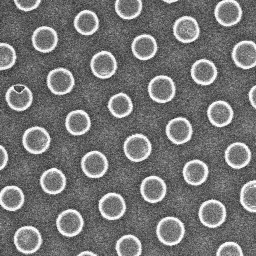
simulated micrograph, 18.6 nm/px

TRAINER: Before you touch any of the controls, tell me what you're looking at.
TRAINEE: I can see a regular array of raised bodies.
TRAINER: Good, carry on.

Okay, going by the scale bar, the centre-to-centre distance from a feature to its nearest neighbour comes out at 830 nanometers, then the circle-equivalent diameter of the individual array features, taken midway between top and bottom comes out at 0.451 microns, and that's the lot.